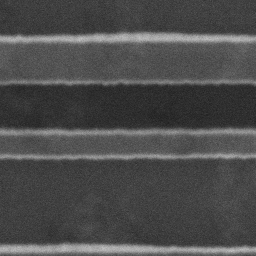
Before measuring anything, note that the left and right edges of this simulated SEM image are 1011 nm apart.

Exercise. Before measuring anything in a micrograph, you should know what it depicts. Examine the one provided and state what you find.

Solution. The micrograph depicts lines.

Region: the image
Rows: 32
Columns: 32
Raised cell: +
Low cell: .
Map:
................................
................................
................................
................................
................................
++++++++++++++++++++++++++++++++
++++++++++++++++++++++++++++++++
++++++++++++++++++++++++++++++++
++++++++++++++++++++++++++++++++
++++++++++++++++++++++++++++++++
................................
................................
................................
................................
................................
................................
...................+......+++...
++++++++++++++++++++++++++++++++
++++++++++++++++++++++++++++++++
+++++++++++++++++++++++++++.+++.
................................
................................
................................
................................
................................
................................
................................
................................
................................
................................
................................
++++++++++++++++++++++++++++++++